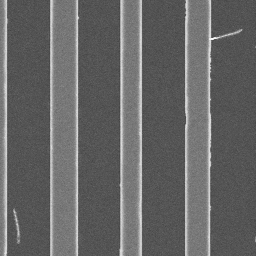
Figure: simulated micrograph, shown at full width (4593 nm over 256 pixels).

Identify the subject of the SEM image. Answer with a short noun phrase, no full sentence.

lines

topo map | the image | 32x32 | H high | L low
HLLLLLHHHHLLLLLHHHLLLLLHHHLLLLLL
HLLLLLHHHHLLLLLHHHLLLLLHHHLLLLLL
HLLLLLHHHHLLLLLHHHLLLLLHHHLLLLLL
HLLLLLHHHHLLLLLHHHLLLLLHHHLLLLLL
HLLLLLHHHHLLLLLHHHLLLLLHHHLLLLLL
HLLLLLHHHHLLLLLHHHLLLLLHHHLLLLLL
HLLLLLHHHHLLLLLHHHLLLLLHHHLLLLLL
HLLLLLHHHHLLLLLHHHLLLLLHHHLLLLLL
HLLLLLHHHHLLLLLHHHLLLLLHHHLLLLLL
HLLLLLHHHHLLLLLHHHLLLLLHHHLLLLLL
HLLLLLHHHHLLLLLHHHLLLLLHHHLLLLLL
HLLLLLHHHHLLLLLHHHLLLLLHHHLLLLLL
HLLLLLHHHHLLLLLHHHLLLLLHHHLLLLLL
HLLLLLHHHHLLLLLHHHLLLLLHHHLLLLLL
HLLLLLHHHHLLLLLHHHLLLLLHHHLLLLLL
HLLLLLHHHHLLLLLHHHLLLLLHHHLLLLLL
HLLLLLHHHHLLLLLHHHLLLLLHHHLLLLLL
HLLLLLHHHHLLLLLHHHLLLLLHHHLLLLLL
HLLLLLHHHHLLLLLHHHLLLLLHHHLLLLLL
HLLLLLHHHHLLLLLHHHLLLLLHHHLLLLLL
HLLLLLHHHHLLLLLHHHLLLLLHHHLLLLLL
HLLLLLHHHHLLLLLHHHLLLLLHHHLLLLLL
HLLLLLHHHHLLLLLHHHLLLLLHHHLLLLLL
HLLLLLHHHHLLLLLHHHLLLLLHHHLLLLLL
HLLLLLHHHHLLLLLHHHLLLLLHHHLLLLLL
HLLLLLHHHHLLLLLHHHLLLLLHHHLLLLLL
HLLLLLHHHHLLLLLHHHLLLLLHHHLLLLLL
HLLLLLHHHHLLLLLHHHLLLLLHHHLLLLLL
HLLLLLHHHHLLLLLHHHLLLLLHHHLLLLLL
HLLLLLHHHHLLLLLHHHLLLLLHHHLLLLLL
HLLLLLHHHHLLLLLHHHLLLLLHHHLLLLLL
HLLLLLHHHHLLLLLHHHLLLLLHHHLLLLLL